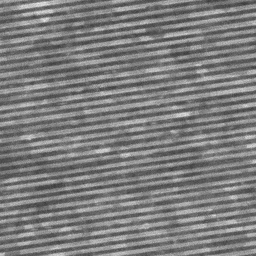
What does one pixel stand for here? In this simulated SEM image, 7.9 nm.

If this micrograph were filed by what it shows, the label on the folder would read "parallel lines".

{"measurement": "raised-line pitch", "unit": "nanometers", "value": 63.9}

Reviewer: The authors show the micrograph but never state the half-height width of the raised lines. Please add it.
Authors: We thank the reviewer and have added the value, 0.0274 µm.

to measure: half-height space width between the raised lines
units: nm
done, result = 34.2